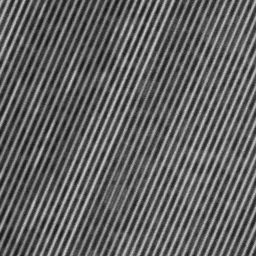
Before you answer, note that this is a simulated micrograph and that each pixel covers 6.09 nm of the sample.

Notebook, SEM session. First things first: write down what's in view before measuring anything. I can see parallel lines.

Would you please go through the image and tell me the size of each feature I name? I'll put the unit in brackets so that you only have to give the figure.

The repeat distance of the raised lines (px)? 6.86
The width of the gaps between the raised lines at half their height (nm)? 35.6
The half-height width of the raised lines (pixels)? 1.03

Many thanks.